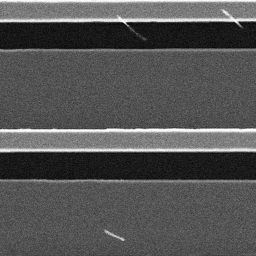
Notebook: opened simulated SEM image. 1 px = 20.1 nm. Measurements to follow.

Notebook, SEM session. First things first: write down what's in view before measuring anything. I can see lines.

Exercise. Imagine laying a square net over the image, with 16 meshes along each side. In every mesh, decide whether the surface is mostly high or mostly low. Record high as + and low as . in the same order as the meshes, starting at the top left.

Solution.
++++++++++++++++
................
................
++++++++++++++++
++++++++++++++++
++++++++++++++++
++++++++++++++++
++++++++++++++++
++++++++++++++++
................
................
++++++++++++++++
++++++++++++++++
++++++++++++++++
++++++++++++++++
++++++++++++++++